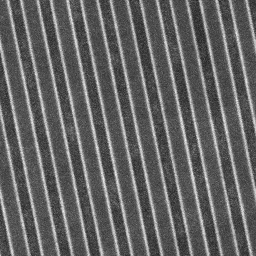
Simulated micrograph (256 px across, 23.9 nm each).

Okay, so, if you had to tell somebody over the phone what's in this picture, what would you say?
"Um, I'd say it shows parallel lines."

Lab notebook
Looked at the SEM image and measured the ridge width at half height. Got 416 nanometres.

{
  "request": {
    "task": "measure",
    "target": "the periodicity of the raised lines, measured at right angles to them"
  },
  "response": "699 nm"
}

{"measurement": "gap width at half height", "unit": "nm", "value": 278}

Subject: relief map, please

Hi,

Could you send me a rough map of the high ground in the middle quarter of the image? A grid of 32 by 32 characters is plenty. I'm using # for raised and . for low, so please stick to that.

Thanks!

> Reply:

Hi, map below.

####...#####...####...#####...##
####....####...####....####...##
#####...####...#####...####...##
.####...####....####...####...##
.####...#####...####...#####...#
.####...#####...####...#####...#
.####....####...####....####...#
.#####...####...#####...####...#
..####...####...#####...####...#
..####...#####...####...#####...
..####...#####...####...#####...
..####....####...####....####...
..#####...####...#####...####...
...####...####...#####...####...
...####...#####...####...#####..
...####...#####...####...#####..
...####....####...####....####..
...#####...####...#####...####..
....####...####...#####...####..
#...####...#####...####...#####.
#...####...#####...####...#####.
#...####....####...####....####.
#...#####...####...#####...####.
#....####...####...#####...####.
##...####...#####...####...#####
##...####...#####...####...#####
##...####....####...####....####
##...#####...####...#####...####
##....####...####....####...####
###...####...#####...####...####
###...####...#####...####...####
###...#####...####...####....###